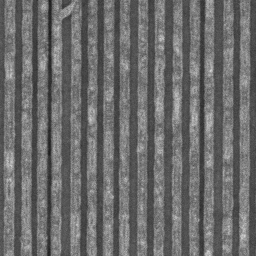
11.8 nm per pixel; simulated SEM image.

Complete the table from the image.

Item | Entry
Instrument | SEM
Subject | parallel lines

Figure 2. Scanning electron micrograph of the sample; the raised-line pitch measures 199 nm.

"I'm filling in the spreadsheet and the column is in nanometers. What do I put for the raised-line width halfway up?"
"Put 102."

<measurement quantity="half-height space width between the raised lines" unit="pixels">7.63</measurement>